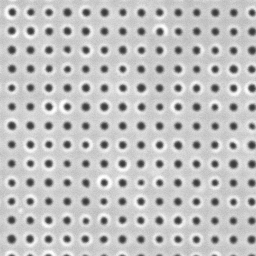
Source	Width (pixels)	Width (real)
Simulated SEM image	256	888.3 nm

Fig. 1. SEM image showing a regular array of holes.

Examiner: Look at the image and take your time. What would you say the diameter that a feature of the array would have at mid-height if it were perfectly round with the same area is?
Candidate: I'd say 0.0274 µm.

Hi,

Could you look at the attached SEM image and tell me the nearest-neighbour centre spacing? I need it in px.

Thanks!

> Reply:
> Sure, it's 18.2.